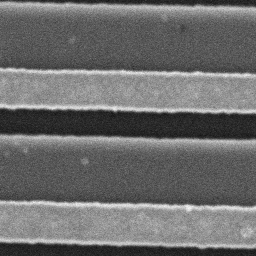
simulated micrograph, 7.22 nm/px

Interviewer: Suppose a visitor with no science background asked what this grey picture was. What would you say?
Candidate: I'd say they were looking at lines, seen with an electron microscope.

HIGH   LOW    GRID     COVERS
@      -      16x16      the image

@@@@@@@@@@@@@@@-
@@@@@@@@@@@@@@@@
@@@@@@@@@@@@@@@@
@@@@@@@@@@@@@@@@
@@@@@@@@@@@@@@@@
@@@@@@@@@@@@@@@@
@@@@@@@@@@@@@@@@
----------------
----------------
@@@@@@@@@@@@@@@@
@@@@@@@@@@@@@@@@
@@@@@@@@@@@@@@@@
@@@@@@@@@@@@@@@@
@@@@@@@@@@@@@@@@
@@@@@@@@@@@@@@@@
----------------